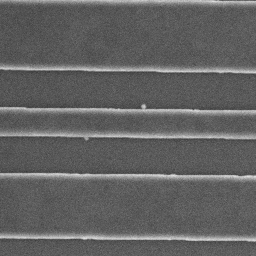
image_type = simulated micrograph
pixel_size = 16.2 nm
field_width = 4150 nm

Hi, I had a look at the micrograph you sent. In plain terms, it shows lines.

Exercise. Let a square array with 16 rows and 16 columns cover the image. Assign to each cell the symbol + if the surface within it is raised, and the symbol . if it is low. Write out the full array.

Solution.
++++++++++++++++
++++++++++++++++
++++++++++++++++
++++++++++++++++
..............++
................
................
++++++++++++++++
....++++++++++++
................
................
++++++++++++++++
++++++++++++++++
++++++++++++++++
++++++++++++++++
................